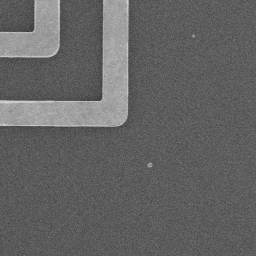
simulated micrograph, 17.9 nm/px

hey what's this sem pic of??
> groups of lines, slits or small figures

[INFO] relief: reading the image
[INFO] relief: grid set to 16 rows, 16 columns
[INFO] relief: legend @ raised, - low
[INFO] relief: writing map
--@@--@@--------
--@@--@@--------
@@@@--@@--------
@@@---@@--------
------@@--------
------@@--------
@@@@@@@@--------
@@@@@@@@--------
----------------
----------------
----------------
----------------
----------------
----------------
----------------
----------------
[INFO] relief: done